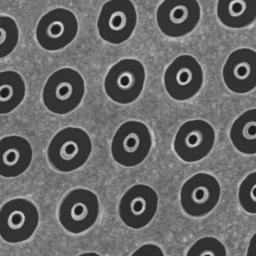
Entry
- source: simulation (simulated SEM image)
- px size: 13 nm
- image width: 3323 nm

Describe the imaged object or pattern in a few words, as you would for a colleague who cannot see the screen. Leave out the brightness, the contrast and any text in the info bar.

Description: a regular array of ring-shaped grooves with a dot in the middle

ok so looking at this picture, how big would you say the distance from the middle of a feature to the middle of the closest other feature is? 757 nm